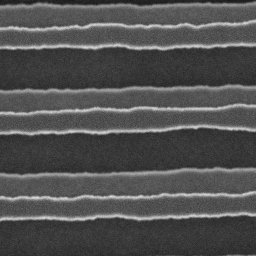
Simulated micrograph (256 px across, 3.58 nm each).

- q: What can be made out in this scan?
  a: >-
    lines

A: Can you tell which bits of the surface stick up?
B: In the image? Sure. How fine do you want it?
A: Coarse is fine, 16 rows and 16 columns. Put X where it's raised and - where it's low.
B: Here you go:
XXXXXXXXXXXXXXXX
XXXXXXXXXXXXXXXX
XXXXXXXXXXXXXXXX
----------------
----------------
--------XX-XXXXX
XXXXXXXXXXXXXXXX
XXXXXXXXXXXXXXXX
----------------
----------------
----------------
XXXXXXXXXXXXXXXX
XXXXXXXXXXXXXXXX
XXXXXXXXXXXXXX--
----------------
----------------